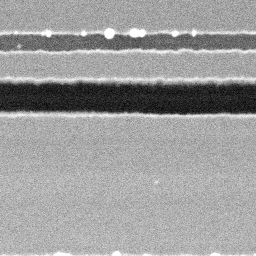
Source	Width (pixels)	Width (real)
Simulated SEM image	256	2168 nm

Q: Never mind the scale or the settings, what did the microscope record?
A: lines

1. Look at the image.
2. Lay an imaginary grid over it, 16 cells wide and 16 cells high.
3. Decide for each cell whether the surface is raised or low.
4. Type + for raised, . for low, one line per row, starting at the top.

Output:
++++++++++++++++
++++++++++++++++
++++++++++++++++
++++++++++++++++
++++++++++++++++
................
................
++++++++++++++++
++++++++++++++++
++++++++++++++++
++++++++++++++++
++++++++++++++++
++++++++++++++++
++++++++++++++++
++++++++++++++++
++++++++++++++++